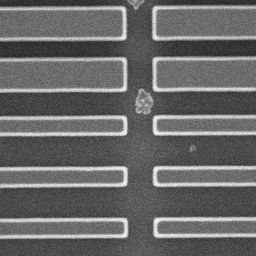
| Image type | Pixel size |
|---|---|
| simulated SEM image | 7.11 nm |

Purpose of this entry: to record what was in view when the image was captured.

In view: groups of lines, slits or small figures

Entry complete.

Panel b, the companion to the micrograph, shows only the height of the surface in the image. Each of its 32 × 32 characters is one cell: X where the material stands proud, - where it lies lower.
--------------------------------
XXXXXXXXXXXXXXXX---XXXXXXXXXXXXX
XXXXXXXXXXXXXXXX---XXXXXXXXXXXXX
XXXXXXXXXXXXXXXX---XXXXXXXXXXXXX
XXXXXXXXXXXXXXXX---XXXXXXXXXXXXX
--------------------------------
--------------------------------
XXXXXXXXXXXXXXX-----XXXXXXXXXXXX
XXXXXXXXXXXXXXXX---XXXXXXXXXXXXX
XXXXXXXXXXXXXXXX---XXXXXXXXXXXXX
XXXXXXXXXXXXXXXX---XXXXXXXXXXXXX
--------------------------------
--------------------------------
--------------------------------
--------------------------------
XXXXXXXXXXXXXXXX---XXXXXXXXXXXXX
XXXXXXXXXXXXXXXX----XXXXXXXXXXXX
--------------------------------
--------------------------------
--------------------------------
--------------------------------
XXXXXXXXXXXXXXXX---XXXXXXXXXXXXX
XXXXXXXXXXXXXXXX---XXXXXXXXXXXXX
--------------------------------
--------------------------------
--------------------------------
--------------------------------
-------XXXXXXXX-----XXXXXXXXXXXX
XXXXXXXXXXXXXXXX---XXXXXXXXXXXXX
XXXXXXXXXXXXXXX-----XXX---------
--------------------------------
--------------------------------